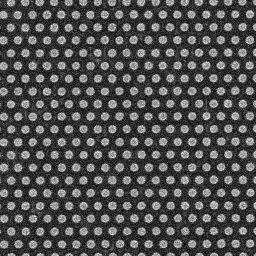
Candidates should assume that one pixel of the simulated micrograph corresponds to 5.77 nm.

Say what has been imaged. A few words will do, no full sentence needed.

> a regular array of raised bodies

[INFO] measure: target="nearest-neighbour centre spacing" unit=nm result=82.3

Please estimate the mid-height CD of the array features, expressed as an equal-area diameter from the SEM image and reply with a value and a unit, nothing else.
44.2 nanometers